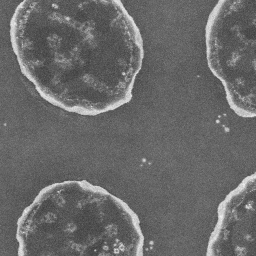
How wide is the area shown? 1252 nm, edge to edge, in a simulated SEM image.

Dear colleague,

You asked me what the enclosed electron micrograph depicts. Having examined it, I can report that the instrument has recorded raised bodies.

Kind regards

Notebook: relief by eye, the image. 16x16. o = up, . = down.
.ooooooo......oo
.ooooooo.....ooo
.oooooooo....ooo
.oooooooo....ooo
..ooooooo....ooo
..oooooo......oo
....ooo........o
................
................
................
................
....o..........o
..ooooo.......oo
.ooooooo......oo
.oooooooo.....oo
.oooooooo....ooo